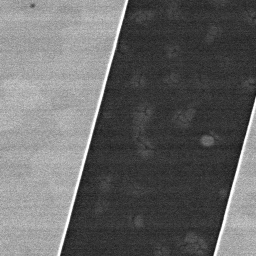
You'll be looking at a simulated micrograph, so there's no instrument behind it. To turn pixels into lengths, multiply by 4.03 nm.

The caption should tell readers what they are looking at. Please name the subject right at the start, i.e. one or a few lines or trenches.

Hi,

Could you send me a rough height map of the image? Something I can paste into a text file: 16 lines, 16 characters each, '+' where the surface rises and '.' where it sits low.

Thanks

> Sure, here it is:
++++++++........
++++++++........
+++++++.........
+++++++.........
+++++++.........
+++++++.........
++++++..........
++++++..........
++++++.........+
+++++..........+
+++++..........+
+++++..........+
+++++.........++
++++..........++
++++..........++
++++..........++